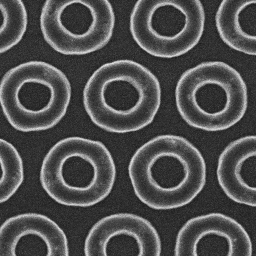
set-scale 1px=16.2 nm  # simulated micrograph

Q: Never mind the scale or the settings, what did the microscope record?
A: ring-shaped raised bodies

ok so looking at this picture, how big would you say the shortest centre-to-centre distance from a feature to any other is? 1410 nm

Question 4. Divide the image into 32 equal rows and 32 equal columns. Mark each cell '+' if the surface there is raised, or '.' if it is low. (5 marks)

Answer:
+++...+++..+++...++++++++...+++.
+++..+++...+++...++....++..+++..
.++..++.....++...++....++..+++..
+++..+++...+++...++....++..+++..
+++...++++++++...+++..+++...+++.
++....+++++++....+++++++.....+++
........+++........++++.......++
................................
..+++++......+++++.......++++...
.+++++++....+++++++....+++++++..
+++...+++..++....+++..+++..+++..
++.....++..++....+++..++....+++.
++....+++..++....+++..++....+++.
+++...++...+++...+++..+++...+++.
.+++++++...++++++++....+++++++..
..+++++.....++++++......+++++...
................................
........+++........++++.......++
++.....++++++.....++++++.....+++
++....+++.++++...+++..+++...+++.
+++...++....++..+++....++..+++..
+++..+++....++..+++....++..+++..
+++..+++....++..+++....++..+++..
++....+++..+++...+++..+++...+++.
+.....+++++++....+++++++.....+++
........+++.......+++++........+
................................
.+++++.......+++++......+++++...
+++++++.....+++++++....+++++++..
+++..+++...+++...+++..+++...+++.
++....++...++....+++..++.....++.
++....++...++.....++..++.....++.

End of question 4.